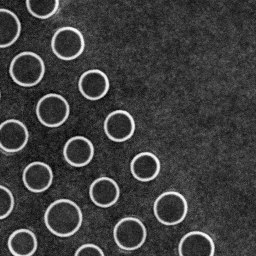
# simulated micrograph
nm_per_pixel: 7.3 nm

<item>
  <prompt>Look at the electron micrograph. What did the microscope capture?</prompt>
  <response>a regular array of raised bodies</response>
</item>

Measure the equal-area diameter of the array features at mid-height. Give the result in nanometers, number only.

219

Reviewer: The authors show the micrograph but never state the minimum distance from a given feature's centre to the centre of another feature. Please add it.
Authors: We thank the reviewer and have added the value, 0.351 um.